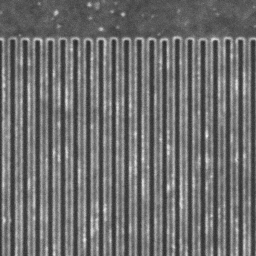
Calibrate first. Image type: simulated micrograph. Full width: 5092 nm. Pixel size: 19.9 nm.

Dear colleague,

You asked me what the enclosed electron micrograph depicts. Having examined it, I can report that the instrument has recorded parallel lines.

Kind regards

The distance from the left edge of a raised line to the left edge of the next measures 252 nanometres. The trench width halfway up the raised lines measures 114 nm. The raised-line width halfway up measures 134 nm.